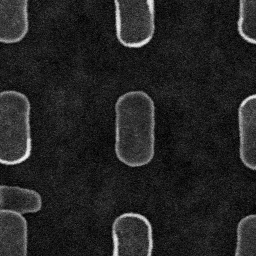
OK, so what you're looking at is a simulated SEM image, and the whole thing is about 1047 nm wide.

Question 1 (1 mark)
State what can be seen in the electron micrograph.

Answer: raised bodies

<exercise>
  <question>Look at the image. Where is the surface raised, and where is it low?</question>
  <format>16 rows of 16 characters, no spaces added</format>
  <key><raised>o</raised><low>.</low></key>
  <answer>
oo.....ooo.....o
oo.....ooo.....o
o.......o......o
................
................
................
oo.....ooo.....o
oo.....ooo.....o
oo.....ooo.....o
oo.....ooo.....o
................
................
................
o.......o.......
oo.....oo......o
oo.....oo......o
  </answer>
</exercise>